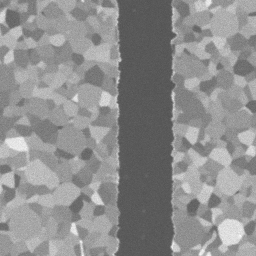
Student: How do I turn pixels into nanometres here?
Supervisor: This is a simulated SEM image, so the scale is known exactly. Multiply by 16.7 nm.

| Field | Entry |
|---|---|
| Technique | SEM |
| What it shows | one or a few lines or trenches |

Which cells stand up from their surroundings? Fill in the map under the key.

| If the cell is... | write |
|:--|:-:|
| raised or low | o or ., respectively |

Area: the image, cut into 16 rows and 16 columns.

ooooooo....ooooo
ooooooo....ooooo
ooooooo....ooooo
ooooooo....ooooo
ooooooo....ooooo
ooooooo....ooooo
ooooooo....ooooo
ooooooo....ooooo
ooooooo....ooooo
ooooooo....ooooo
ooooooo....ooooo
ooooooo....ooooo
ooooooo....ooooo
ooooooo....ooooo
ooooooo....ooooo
ooooooo....ooooo